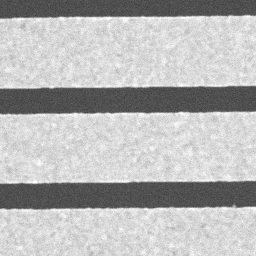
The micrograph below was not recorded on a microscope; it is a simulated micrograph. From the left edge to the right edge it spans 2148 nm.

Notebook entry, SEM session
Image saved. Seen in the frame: lines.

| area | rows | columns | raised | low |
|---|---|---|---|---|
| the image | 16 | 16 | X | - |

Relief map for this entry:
----------------
XXXXXXXXXXXXXXXX
XXXXXXXXXXXXXXXX
XXXXXXXXXXXXXXXX
XXXXXXXXXXXXXXXX
----------------
----------------
XXXXXXXXXXXXXXXX
XXXXXXXXXXXXXXXX
XXXXXXXXXXXXXXXX
XXXXXXXXXXXXXXXX
----------------
----------------
XXXXXXXXXXXXXXXX
XXXXXXXXXXXXXXXX
XXXXXXXXXXXXXXXX